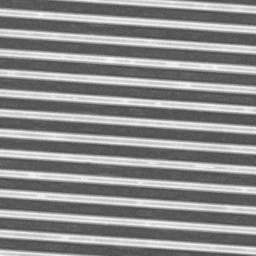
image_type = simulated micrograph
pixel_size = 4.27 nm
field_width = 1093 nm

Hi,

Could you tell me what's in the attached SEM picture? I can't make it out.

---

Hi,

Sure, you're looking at parallel lines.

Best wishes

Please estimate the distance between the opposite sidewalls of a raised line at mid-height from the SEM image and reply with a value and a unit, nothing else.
0.0277 µm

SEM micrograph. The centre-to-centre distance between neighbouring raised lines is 85.7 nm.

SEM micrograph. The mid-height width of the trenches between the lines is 54.9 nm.